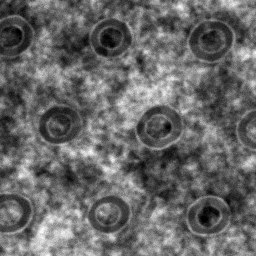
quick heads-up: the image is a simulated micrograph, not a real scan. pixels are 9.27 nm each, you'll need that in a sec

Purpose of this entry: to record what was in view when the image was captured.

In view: ring-shaped raised bodies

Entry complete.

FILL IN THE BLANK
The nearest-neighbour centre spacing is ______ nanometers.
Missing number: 920